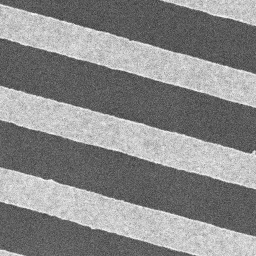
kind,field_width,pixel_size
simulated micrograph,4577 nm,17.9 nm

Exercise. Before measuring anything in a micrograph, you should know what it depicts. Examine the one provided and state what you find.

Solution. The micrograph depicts one or a few lines or trenches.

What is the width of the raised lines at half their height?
567 nanometres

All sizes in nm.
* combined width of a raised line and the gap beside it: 1410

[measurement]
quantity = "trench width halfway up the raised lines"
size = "845 nm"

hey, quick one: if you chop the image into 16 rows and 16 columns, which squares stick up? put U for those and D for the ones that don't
UDDDDDDDDDDDUUUU
UUUUUDDDDDDDDDDD
DUUUUUUUDDDDDDDD
DDDDUUUUUUUUDDDD
DDDDDDDDUUUUUUUD
DDDDDDDDDDDDUUUU
UUUUDDDDDDDDDDDU
UUUUUUUUDDDDDDDD
DDDDUUUUUUUUDDDD
DDDDDDDDUUUUUUUD
DDDDDDDDDDDUUUUU
UUUUDDDDDDDDDDDU
UUUUUUUDDDDDDDDD
DDDUUUUUUUUDDDDD
DDDDDDDUUUUUUUUD
DDDDDDDDDDDUUUUU